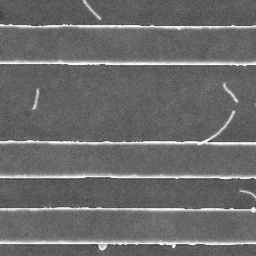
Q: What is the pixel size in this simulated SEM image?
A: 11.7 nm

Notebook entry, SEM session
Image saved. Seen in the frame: lines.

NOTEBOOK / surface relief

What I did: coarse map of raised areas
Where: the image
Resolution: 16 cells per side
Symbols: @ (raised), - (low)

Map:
----------------
----------------
@@@@@@@@@@@@@@@@
@@@@@@@@@@@@@@@@
----------------
----------------
----------------
----------------
----------------
@@@@@@@@@@@@@@@@
@@@@@@@@@@@@@@@@
----------------
----------------
@@@@@@@@@@@@@@@@
@@@@@@@@@@@@@@@@
----------------